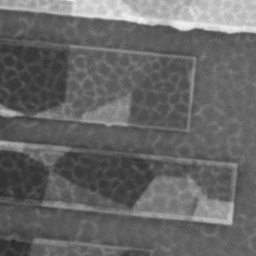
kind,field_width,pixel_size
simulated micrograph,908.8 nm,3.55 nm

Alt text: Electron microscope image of one or a few lines or trenches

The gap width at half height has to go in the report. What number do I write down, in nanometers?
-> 110